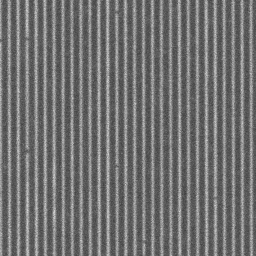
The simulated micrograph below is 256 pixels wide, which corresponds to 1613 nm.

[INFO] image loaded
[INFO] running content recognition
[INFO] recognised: parallel lines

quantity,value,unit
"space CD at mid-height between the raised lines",6.76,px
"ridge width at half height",0.0118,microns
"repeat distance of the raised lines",56.6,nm